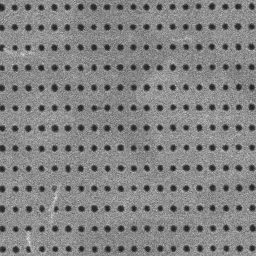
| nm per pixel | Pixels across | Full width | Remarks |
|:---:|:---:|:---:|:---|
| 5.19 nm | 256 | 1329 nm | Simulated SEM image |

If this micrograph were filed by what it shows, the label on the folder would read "a regular array of holes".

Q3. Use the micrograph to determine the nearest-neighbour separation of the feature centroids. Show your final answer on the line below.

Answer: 0.0676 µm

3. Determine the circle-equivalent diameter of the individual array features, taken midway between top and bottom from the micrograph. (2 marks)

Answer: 35.6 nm